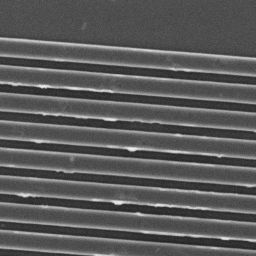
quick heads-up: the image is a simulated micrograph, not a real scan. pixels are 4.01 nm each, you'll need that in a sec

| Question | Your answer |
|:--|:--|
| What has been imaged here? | parallel lines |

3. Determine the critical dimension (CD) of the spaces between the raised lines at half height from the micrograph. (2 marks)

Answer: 0.0329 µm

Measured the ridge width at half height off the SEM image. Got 0.0759 microns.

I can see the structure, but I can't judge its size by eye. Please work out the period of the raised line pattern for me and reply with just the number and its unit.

110 nm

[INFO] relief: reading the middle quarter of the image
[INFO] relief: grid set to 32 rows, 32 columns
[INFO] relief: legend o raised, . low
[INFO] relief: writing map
.................ooooooooooooooo
...........................ooooo
ooooooooooo.....................
oooooooooooooooooooooooo........
oooooooooooooooooooooooooooooooo
oooooooooooooooooooooooooooooooo
....oooooooooooooooooooooooooooo
................oooooooooooooooo
o............................ooo
oooooooooooooo..................
oooooooooooooooooooooooooo......
oooooooooooooooooooooooooooooooo
oooooooooooooooooooooooooooooooo
...ooooooooooooooooooooooooooooo
...................ooooooooooooo
o..............................o
ooooooooooooo...................
oooooooooooooooooooooooooo......
oooooooooooooooooooooooooooooooo
oooooooooooooooooooooooooooooooo
.........ooooooooooooooooooooooo
................oooo.ooooooooooo
ooo.............................
oooooooooooooooo................
oooooooooooooooooooooooooooo....
oooooooooooooooooooooooooooooooo
oooooooooooooooooooooooooooooooo
........oooooooooooooooooooooooo
.....................ooooooooooo
ooooo...........................
oooooooooooooooooo..............
oooooooooooooooooooooooooooooo..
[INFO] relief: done